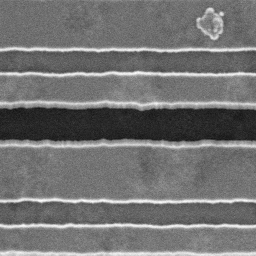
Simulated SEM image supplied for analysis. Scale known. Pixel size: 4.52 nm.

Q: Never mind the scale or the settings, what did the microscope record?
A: lines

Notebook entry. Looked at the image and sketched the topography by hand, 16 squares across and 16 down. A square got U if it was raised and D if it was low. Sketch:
UUUUUUUUUUUUUUUU
UUUUUUUUUUUUUUUU
UUUUUUUUUUUUUUUU
UUUUUUUUUUUUUUUU
UUUUUUUUUUUUUUUU
UUUUUUUUUUUUUUUU
UUUUUUUUUUUUUUUU
DDDDDDDDDDDDDDDD
DDDDDDDDDDDDDDDD
UUUUUUUUUUUUUUUU
UUUUUUUUUUUUUUUU
UUUUUUUUUUUUUUUU
UUUUUUUUUUUUUUUU
UUUUUUUUUUUUUUUU
UUUUUUUUUUUUUUUU
UUUUUUUUUUUUUUUU